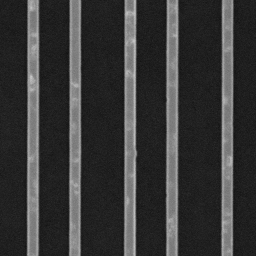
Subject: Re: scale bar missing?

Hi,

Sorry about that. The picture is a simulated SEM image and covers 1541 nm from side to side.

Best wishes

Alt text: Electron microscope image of parallel lines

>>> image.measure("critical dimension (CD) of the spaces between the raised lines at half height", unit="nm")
229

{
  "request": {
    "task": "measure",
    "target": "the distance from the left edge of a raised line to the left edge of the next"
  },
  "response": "0.292 µm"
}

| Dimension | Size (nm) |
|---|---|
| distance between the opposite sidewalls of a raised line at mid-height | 62.5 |